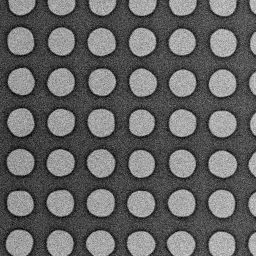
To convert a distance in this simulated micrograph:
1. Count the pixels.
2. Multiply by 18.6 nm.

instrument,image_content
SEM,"an array of small figures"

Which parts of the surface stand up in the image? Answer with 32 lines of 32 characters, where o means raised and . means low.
.ooo..ooo..ooo..ooo..oooo.ooo..o
..oo...oo...oo...oo...oo...oo...
................................
..o....o........................
.ooo..ooo..ooo..ooo..ooo..ooo...
.ooo..ooo..ooo..ooo..ooo..ooo..o
..oo...oo...oo...oo...oo...oo...
................................
................................
.ooo..ooo..ooo..ooo...oo...oo...
.ooo..ooo..ooo..oooo.ooo..ooo..o
..oo..ooo...oo...oo...oo...oo...
................................
................................
.ooo..ooo..ooo..ooo..ooo..ooo...
.ooo..ooo..ooo..ooo..ooo..ooo..o
..oo..ooo...oo..ooo...oo..ooo...
................................
................................
.ooo..ooo..ooo..ooo..ooo..ooo...
.ooo..ooo..ooo..ooo..ooo..oooo.o
.ooo..ooo..ooo..ooo...oo..ooo..o
................................
................................
.ooo..ooo..ooo..ooo..ooo..ooo..o
.ooo..ooo..ooo..ooo..ooo..ooo..o
.ooo..ooo..ooo..ooo..ooo...oo..o
................................
................................
.ooo..ooo..ooo..ooo..ooo...oo...
.ooo..ooo..ooo..ooo..ooo..ooo..o
.ooo..ooo..ooo..ooo..ooo..ooo..o